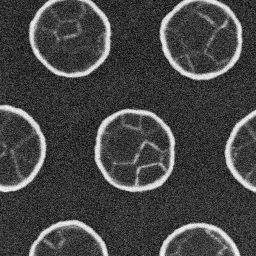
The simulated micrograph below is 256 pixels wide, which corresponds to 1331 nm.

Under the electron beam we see raised bodies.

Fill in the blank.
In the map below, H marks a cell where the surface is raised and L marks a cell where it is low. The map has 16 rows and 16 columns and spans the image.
LLLHHHLLLLLHHHLL
LLHHHHHLLLHHHHHL
LLHHHHHLLLHHHHHL
LLHHHHHLLLLHHHHL
LLLLHLLLLLLHHHLL
LLLLLLLLLLLLLLLL
LLLLLLLLLLLLLLLL
HHLLLLLHHHLLLLLH
HHHLLLHHHHHLLLLH
HHHLLLHHHHHLLLHH
HHLLLLHHHHHLLLHH
HLLLLLLHHHLLLLLH
LLLLLLLLLLLLLLLL
LLLLLLLLLLLLLLLL
LLLHHHLLLLLHHHLL
LLHHHHLLLLHHHHHL